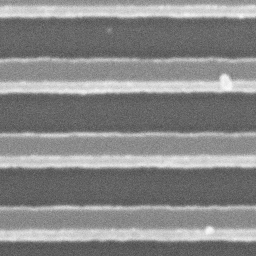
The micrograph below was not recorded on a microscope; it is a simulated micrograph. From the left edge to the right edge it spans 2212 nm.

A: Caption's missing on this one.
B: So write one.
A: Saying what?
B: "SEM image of lines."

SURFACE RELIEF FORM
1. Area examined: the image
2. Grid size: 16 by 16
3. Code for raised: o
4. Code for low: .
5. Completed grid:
oooooooooooooooo
................
................
................
oooooooooooooooo
oooooooooooooooo
................
................
oooooooooooooooo
oooooooooooooooo
................
................
................
oooooooooooooooo
oooooooooooooooo
................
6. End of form